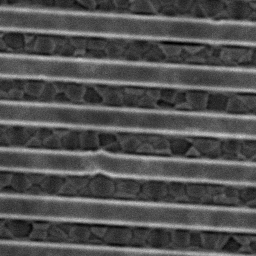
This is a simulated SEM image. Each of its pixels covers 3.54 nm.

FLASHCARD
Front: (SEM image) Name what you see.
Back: parallel lines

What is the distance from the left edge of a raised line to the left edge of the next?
0.165 um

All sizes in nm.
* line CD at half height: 80.7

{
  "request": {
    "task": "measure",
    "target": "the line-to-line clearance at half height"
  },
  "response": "0.0842 um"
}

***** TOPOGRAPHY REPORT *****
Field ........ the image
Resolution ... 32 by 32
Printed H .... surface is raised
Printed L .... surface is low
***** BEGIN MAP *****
LLLLLLLLLLLLLLLLLLLLLLLLLLLLLLLL
HHHHHHHHHHLLLLLLLLLLLLLLLLLLLLLL
HHHHHHHHHHHHHHHHHHHHHHHHHHLLLLLL
HHHHHHHHHHHHHHHHHHHHHHHHHHHHHHHH
LLLLLLLLLLLLLHHHHHHHHHHHHHHHHHHH
LLLLLLLLLLLLLLLLLLLLLLLLLLLLLHHH
LLLLLLLLLLLLLLLLLLLLLLLLLLLLLLLL
HHHHHHHHHHHHLLLLLLLLLLLLLLLLLLLL
HHHHHHHHHHHHHHHHHHHHHHHHHHHHHLLL
HHHHHHHHHHHHHHHHHHHHHHHHHHHHHHHH
LLLLLLLLLLLLLLLLHHHHHHHHHHHHHHHH
LLLLLLLLLLLLLLLLLLLLLLLLLLLLLLLL
LLLLLLLLLLLLLLLLLLLLLLLLLLLLLLLL
HHHHHHHHHHHHHHHLLLLLLLLLLLLLLLLL
HHHHHHHHHHHHHHHHHHHHHHHHHHHHHHHL
LLHHHHHHHHHHHHHHHHHHHHHHHHHHHHHH
LLLLLLLLLLLLLLLLLLHHHHHHHHHHHHHH
LLLLLLLLLLLLLLLLLLLLLLLLLLLLLLLL
HLLLLLLLLLLLLLLLLLLLLLLLLLLLLLLL
HHHHHHHHHHHHHHHHHLLLLLLLLLLLLLLL
HHHHHHHHHHHHHHHHHHHHHHHHHHHHHHHH
LLLLHHHHHHHHHHHHHHHHHHHHHHHHHHHH
LLLLLLLLLLLLLLLLLLLLLHHHHHHHHHHH
LLLLLLLLLLLLLLLLLLLLLLLLLLLLLLLL
HHHHLLLLLLLLLLLLLLLLLLLLLLLLLLLL
HHHHHHHHHHHHHHHHHHHHLLLLLLLLLLLL
HHHHHHHHHHHHHHHHHHHHHHHHHHHHHHHH
LLLLLLLHHHHHHHHHHHHHHHHHHHHHHHHH
LLLLLLLLLLLLLLLLLLLLLLLLHHHHHHHH
LLLLLLLLLLLLLLLLLLLLLLLLLLLLLLLL
HHHHHHLLLLLLLLLLLLLLLLLLLLLLLLLL
HHHHHHHHHHHHHHHHHHHHHHHLLLLLLLLL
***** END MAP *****